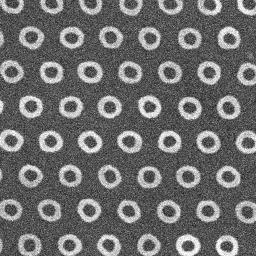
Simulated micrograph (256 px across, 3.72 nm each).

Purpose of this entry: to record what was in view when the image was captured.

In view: a regular array of ring-shaped raised bodies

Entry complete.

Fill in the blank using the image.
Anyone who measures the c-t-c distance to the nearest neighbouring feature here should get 144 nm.